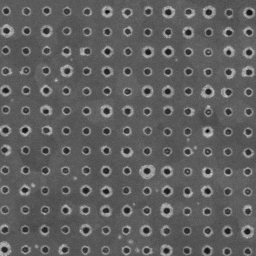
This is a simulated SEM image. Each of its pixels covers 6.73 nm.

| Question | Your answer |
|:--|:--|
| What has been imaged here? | a regular array of holes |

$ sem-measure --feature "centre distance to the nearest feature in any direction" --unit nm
132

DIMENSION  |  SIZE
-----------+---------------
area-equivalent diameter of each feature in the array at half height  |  45.9 nm